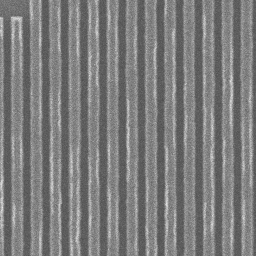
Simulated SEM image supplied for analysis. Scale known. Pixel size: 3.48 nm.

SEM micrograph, parallel lines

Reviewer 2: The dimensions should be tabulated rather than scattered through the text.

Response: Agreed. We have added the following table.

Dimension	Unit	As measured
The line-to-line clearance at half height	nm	29.6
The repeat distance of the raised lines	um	0.0666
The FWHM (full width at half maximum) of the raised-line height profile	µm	0.0378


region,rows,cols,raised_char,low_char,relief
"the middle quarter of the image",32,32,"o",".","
.ooo..ooo..oo...oo...oo..ooo..oo
.ooo..ooo..oo...oo...oo..ooo..oo
.ooo..ooo..oo...oo...oo..ooo..oo
.ooo..ooo..oo...oo...oo..ooo..oo
.ooo..ooo..oo...oo..ooo..ooo..oo
.ooo..ooo..oo...oo..ooo..ooo..oo
.ooo..ooo..oo...oo..ooo..ooo..oo
.ooo..ooo..oo...oo..ooo..ooo..oo
.ooo..ooo..oo...oo...oo..ooo..oo
.ooo..ooo..oo...oo..ooo..ooo..oo
.ooo..ooo..oo...oo..ooo..ooo..oo
.ooo..ooo..oo...oo..ooo..ooo..oo
..oo..ooo..oo...oo..ooo..ooo..oo
..oo..ooo..oo...oo...oo..ooo..oo
..oo..ooo..oo...oo...oo..ooo..oo
.ooo..ooo..oo...oo..ooo..ooo..oo
..oo..ooo..oo...oo..ooo..ooo..oo
..oo..ooo..oo...oo...oo..ooo..oo
..oo..ooo..oo...oo...oo..ooo..oo
.ooo..ooo..oo...oo..ooo..ooo..oo
.ooo..ooo..oo...oo...oo..ooo..oo
.ooo..ooo..oo...oo...oo..ooo..oo
.ooo..ooo..oo...oo..ooo..ooo..oo
.ooo..ooo..oo...oo..ooo..ooo..oo
.ooo..ooo..oo...oo...oo..ooo..oo
.ooo..ooo..oo...oo..ooo..ooo..oo
.ooo..ooo..oo...oo..ooo...oo..oo
.ooo..ooo..oo...oo..ooo..ooo..oo
.ooo..ooo..oo...oo...oo..ooo..oo
.ooo..ooo..oo...oo...oo..ooo..oo
..oo..ooo..oo...oo...oo...oo..oo
.ooo..ooo..oo...oo...oo..ooo..oo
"